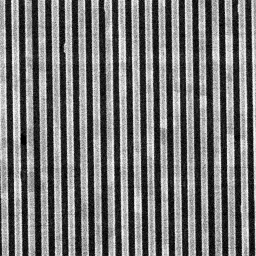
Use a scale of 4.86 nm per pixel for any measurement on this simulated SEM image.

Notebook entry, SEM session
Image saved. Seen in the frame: parallel lines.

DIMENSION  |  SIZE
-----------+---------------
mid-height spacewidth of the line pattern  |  7.24 px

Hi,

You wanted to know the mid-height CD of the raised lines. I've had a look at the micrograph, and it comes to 31 nm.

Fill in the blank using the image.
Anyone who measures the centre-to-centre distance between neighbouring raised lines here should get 64.8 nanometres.